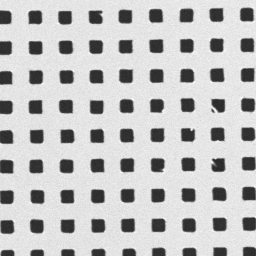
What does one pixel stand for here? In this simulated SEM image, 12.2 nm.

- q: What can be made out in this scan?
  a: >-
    a regular array of holes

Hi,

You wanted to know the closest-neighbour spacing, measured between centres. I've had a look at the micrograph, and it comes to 0.359 um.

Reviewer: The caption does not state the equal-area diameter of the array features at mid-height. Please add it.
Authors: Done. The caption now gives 186 nm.